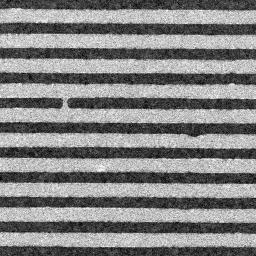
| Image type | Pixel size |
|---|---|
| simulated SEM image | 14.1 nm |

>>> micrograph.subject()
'parallel lines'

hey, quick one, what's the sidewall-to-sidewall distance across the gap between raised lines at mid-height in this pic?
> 186 nm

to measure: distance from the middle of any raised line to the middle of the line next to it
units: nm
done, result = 350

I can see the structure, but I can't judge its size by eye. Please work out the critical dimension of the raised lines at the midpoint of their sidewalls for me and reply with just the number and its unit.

166 nanometres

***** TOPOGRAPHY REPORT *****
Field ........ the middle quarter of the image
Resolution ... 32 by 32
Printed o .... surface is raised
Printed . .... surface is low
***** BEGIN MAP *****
................................
................................
oooooooooooooooooooooooooooooooo
oooooooooooooooooooooooooooooooo
oooooooooooooooooooooooooooooooo
................................
................................
................................
...oooooooooooooooooooooooo...o.
.ooooooooooooooooooooooooooooooo
.ooooooooooooooooooooooooooooooo
................................
................................
................................
................................
oooooooooooooooooooooooooooooooo
oooooooooooooooooooooooooooooooo
......................ooo..ooooo
................................
................................
................................
oooooooooooooooooooooooooooooooo
oooooooooooooooooooooooooooooooo
oooooooooooooooooooooooooooooooo
................................
................................
................................
oooooooooooooooooooooooooooooooo
oooooooooooooooooooooooooooooooo
oooooooooooooooooooooooooooooooo
................................
................................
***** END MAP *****